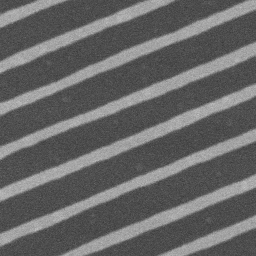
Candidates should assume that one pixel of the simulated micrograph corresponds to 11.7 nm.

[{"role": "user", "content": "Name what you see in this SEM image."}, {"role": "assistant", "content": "parallel lines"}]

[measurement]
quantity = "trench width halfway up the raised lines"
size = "356 nm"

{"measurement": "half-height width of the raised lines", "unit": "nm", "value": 121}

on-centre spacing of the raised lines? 471 nanometres